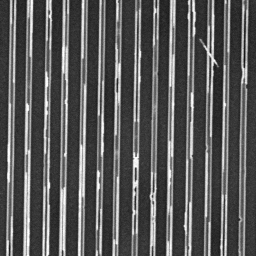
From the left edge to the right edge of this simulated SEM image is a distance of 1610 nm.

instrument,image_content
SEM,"parallel lines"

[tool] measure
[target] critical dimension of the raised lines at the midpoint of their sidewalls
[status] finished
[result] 33 nm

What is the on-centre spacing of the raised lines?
17.9 px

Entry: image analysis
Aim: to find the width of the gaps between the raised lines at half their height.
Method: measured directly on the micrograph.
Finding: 80.2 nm